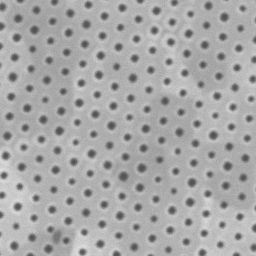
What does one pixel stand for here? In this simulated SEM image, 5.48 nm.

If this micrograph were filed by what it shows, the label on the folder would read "a regular array of holes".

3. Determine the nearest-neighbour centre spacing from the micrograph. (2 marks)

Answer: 107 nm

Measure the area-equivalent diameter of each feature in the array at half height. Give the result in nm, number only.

43.3